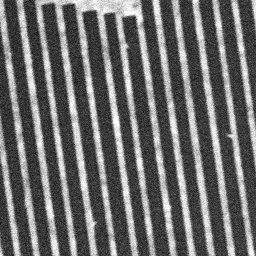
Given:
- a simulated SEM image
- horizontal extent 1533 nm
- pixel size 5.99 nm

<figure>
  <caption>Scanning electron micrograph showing parallel lines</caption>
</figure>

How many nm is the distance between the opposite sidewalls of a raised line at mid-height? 30.3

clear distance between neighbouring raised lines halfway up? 85.2 nm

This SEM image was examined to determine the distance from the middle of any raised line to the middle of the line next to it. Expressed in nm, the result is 116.